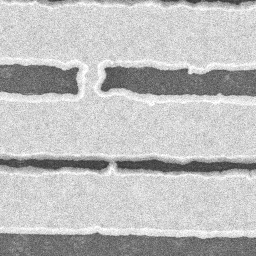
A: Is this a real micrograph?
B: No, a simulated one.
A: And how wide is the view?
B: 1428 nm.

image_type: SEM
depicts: one or a few lines or trenches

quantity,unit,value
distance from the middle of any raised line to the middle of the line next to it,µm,0.465